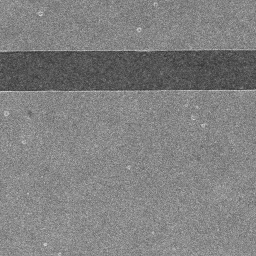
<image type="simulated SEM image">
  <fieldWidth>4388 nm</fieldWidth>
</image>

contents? one or a few lines or trenches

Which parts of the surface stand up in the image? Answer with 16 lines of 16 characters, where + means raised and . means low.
++++++++++++++++
++++++++++++++++
++++++++++++++++
................
................
................
++++++++++++++++
++++++++++++++++
++++++++++++++++
++++++++++++++++
++++++++++++++++
++++++++++++++++
++++++++++++++++
++++++++++++++++
++++++++++++++++
++++++++++++++++